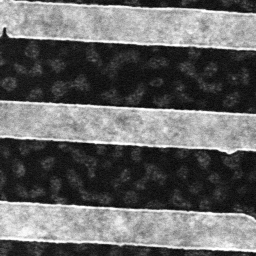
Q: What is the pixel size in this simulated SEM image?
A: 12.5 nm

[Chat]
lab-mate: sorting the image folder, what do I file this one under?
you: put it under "one or a few lines or trenches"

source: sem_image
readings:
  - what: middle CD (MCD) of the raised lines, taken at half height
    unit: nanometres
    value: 445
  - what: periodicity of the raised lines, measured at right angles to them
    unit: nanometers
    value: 1260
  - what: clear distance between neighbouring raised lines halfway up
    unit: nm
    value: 819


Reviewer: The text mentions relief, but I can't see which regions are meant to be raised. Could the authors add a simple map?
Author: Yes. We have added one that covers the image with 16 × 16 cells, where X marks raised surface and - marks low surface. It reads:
XXXXXXXX--------
XXXXXXXXXXXXXXXX
-----XXXXXXXXXXX
----------------
----------------
----------------
XXX-------------
XXXXXXXXXXXXXXXX
XXXXXXXXXXXXXXXX
----------------
----------------
----------------
----------------
XXXXXXXXXXXXXXX-
XXXXXXXXXXXXXXXX
------------XXXX